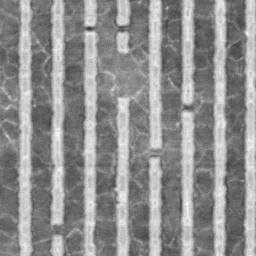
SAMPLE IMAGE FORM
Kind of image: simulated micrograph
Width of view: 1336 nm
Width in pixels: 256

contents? parallel lines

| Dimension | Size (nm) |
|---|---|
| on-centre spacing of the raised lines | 168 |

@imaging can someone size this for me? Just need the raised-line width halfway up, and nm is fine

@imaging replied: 50.9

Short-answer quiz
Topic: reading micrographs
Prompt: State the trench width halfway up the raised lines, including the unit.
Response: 117 nm